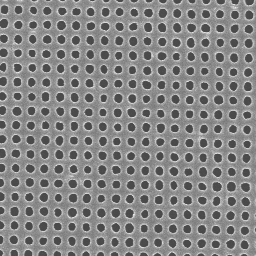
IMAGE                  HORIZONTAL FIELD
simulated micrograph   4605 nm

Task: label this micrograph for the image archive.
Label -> a regular array of holes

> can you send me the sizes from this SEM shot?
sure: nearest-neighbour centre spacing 14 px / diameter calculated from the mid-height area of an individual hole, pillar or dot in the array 0.15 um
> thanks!